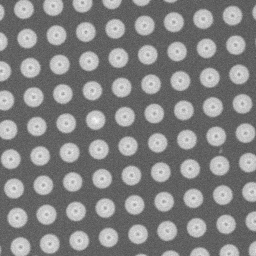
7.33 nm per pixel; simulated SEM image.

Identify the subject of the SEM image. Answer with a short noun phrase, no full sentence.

an array of small figures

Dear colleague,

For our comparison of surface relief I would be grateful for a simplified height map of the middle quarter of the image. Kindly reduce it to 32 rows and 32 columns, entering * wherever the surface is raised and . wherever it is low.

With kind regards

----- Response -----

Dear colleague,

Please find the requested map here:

*...****....***.................
*....**.........................
...........................****.
....................****...****.
......**....****....****...****.
*....****...*****..*****...****.
**...****...*****...****....**..
**...****....***................
**....***.......................
*............................**.
.....................***....****
..............***...*****...****
......****...*****..*****...****
**....****...*****..*****....**.
***...****...****.....*.........
***...****.....*................
**..............................
.......................*.....***
...............**....****...****
.......***....****...*****..****
***...*****...****...*****...***
****..*****...****....***.......
****...****....**...............
***.....**......................
..............................**
......................****...***
........***....****...****...***
.**.....****...****...****....**
****...*****...****...****.....*
****...*****...****.............
****....***.....................
.**............................*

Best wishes